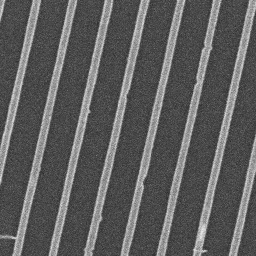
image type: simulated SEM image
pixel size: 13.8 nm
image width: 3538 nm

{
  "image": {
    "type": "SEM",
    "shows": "parallel lines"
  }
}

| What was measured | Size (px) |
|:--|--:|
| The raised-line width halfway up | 7.08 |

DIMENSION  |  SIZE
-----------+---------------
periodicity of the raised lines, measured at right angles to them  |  0.487 µm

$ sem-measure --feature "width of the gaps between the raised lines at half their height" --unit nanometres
396